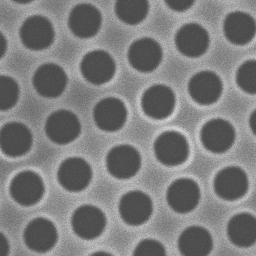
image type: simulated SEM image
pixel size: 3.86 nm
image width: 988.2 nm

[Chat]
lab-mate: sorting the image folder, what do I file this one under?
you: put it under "a regular array of holes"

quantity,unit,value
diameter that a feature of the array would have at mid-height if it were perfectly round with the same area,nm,133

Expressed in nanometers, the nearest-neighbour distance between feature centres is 188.